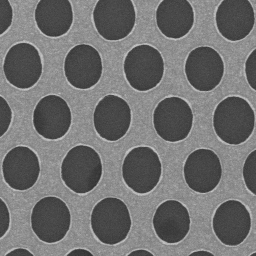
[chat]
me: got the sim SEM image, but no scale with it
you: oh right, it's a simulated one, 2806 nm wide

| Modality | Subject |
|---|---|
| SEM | a regular array of holes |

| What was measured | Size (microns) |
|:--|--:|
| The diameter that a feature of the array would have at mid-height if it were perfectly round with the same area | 0.467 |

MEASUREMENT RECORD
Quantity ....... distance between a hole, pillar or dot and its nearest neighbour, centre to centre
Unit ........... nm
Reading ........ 650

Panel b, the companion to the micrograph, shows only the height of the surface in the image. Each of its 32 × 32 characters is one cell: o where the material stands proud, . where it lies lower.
.oooo....ooo.....ooo....ooo....o
..oo.....ooo.....ooo....ooo.....
.ooo.....ooo.....ooo....ooo.....
.oooo....ooo.....ooo....ooo.....
oooooo..ooooo...ooooo..ooooo...o
oo..oooooooooooooooooooooooooooo
o....oooo...oooo....oooo...oooo.
o....ooo.....ooo....ooo.....ooo.
.....ooo.....oo......oo.....ooo.
o....ooo.....ooo....ooo.....ooo.
o...ooooo...oooo....oooo...oooo.
oooooooooooooooooooooooooooooooo
.oooo...ooooo...oooo...ooooo...o
.ooo.....ooo....ooo.....ooo.....
..oo.....ooo....ooo.....ooo.....
.ooo.....ooo....ooo.....ooo.....
.oooo...oooo....oooo....ooo....o
ooooooooooooo..oooooo..ooooo...o
oo..ooooo..oooooo..ooooooooooooo
o....ooo....oooo....oooo...oooo.
.....ooo.....oo.....ooo.....ooo.
.....ooo.....oo.....ooo.....oo..
o....ooo....ooo.....ooo.....ooo.
o...ooooo...oooo...ooooo...oooo.
oooooooooooooooooooooooooooooooo
.ooo....oooo....oooo...ooooo..oo
.ooo.....oo.....ooo.....ooo....o
.ooo.....oo.....ooo.....ooo....o
.ooo.....oo.....ooo.....ooo....o
ooooo...oooo....oooo...oooo....o
ooooooooooooo..ooooooooooooo..oo
o...ooooo..ooooo...ooooo..oooooo